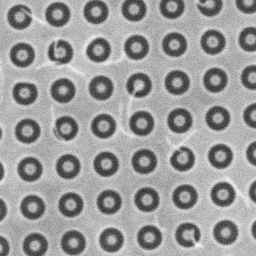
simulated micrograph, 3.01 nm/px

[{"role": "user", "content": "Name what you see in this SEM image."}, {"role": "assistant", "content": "an array of small figures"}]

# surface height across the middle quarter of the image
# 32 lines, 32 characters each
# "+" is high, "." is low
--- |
++++++++++++++++++++++++++++++++
+++++++++++++++++++++++++++..+++
+++++++++++++++++....+++++.....+
.++++++....+++++......+++......+
..++++......++++......+++.......
...+++.......++.......+++.......
...+++.......+++......++++.....+
...+++......++++.....+++++....++
...++++.....++++++..++++++++++++
..++++++++++++++++++++++++++++++
++++++++++++++++++++++++++++++++
+++++++++++++++++++.+++++++....+
+++++++++..++++++.....++++......
..+++++......+++......++++......
...++++......+++.......+++......
....++.......+++.......+++......
....+++......++++.....++++.....+
...++++......+++++....++++++.+++
...+++++....++++++++++++++++++++
++++++++++++++++++++++++++++++++
+++++++++++++++++++++++++++++.++
++++++++++++++++++....+++++.....
..++++++.....++++......++++.....
....+++......++++......+++......
....+++.......+++.......++......
....+++.......+++......++++.....
....+++.......+++......+++++....
....++++.....++++++..+++++++++++
...+++++++++++++++++++++++++++++
++++++++++++++++++++++++++++++++
++++++++++++++++++++.+++++++....
++++++++++...+++++.....++++.....